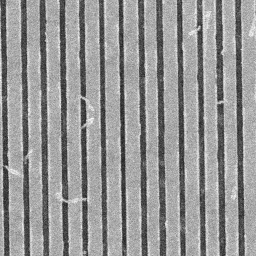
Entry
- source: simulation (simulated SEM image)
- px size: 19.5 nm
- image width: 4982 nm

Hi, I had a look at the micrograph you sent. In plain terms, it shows parallel lines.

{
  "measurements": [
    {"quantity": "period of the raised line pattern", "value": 381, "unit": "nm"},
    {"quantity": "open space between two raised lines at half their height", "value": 129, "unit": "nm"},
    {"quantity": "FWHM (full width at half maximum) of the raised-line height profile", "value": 260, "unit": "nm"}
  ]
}